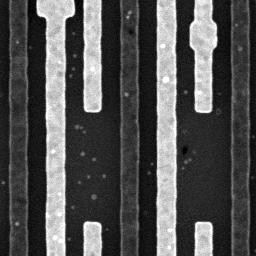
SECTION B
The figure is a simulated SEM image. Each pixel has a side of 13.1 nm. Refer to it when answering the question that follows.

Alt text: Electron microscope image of wiring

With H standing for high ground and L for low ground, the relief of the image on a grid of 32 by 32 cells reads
LHHLLHHHHLLHHLLHHLLLHHLLHHHLLHHL
LHHLLHHHHLLHHLLHHLLLHHLLHHHLLHHL
LHHLLLHHLLLHHLLHHLLLHHLLHHHLLHHL
LHHLLLHHLLLHHLLHHLLLHHLLHHHLLHHL
LHHLLLHHLLLHHLLHHLLLHHLLHHHLLHHL
LHHLLLHHLLLHHLLHHLLLHHLLHHHLLHHL
LHHLLLHHLLLHHLLHHLLLHHLLHHHLLHHL
LHHLLLHHLLLHHLLHHLLLHHLLHHLLLHHL
LHHLLLHHLLLHHLLHHLLLHHLLHHLLLHHL
LHHLLLHHLLLHHLLHHLLLHHLLHHLLLHHL
LHHLLLHHLLLHHLLHHLLLHHLLHHLLLHHL
LHHLLLHHLLLHHLLHHLLLHHLLHHLLLHHL
LHHLLLHHLLLHHLLHHLLLHHLLHHLLLHHL
LHHLLLHHLLLHHLLHHLLLHHLLHHLLLHHL
LHHLLLHHLLLLLLLHHLLLHHLLLLLLLHHL
LHHLLLHHLLLLLLLHHLLLHHLLLLLLLHHL
LHHLLLHHLLLLLLLHHLLLHHLLLLLLLHHL
LHHLLLHHLLLLLLLHHLLLHHLLLLLLLHHL
LHHLLLHHLLLLLLLHHLLLHHLLLLLLLHHL
LHHLLLHHLLLLLLLHHLLLHHLLLLLLLHHL
LHHLLLHHLLLLLLLHHLLLHHLLLLLLLHHL
LHHLLLHHLLLLLLLHHLLLHHLLLLLLLHHL
LHHLLLHHLLLLLLLHHLLLHHLLLLLLLHHL
LHHLLLHHLLLLLLLHHLLLHHLLLLLLLHHL
LHHLLLHHLLLLLLLHHLLLHHLLLLLLLHHL
LHHLLLHHLLLLLLLHHLLLHHLLLLLLLHHL
LHHLLLHHLLLLLLLHHLLLHHLLLLLLLHHL
LHHLLLHHLLLLLLLHHLLLHHLLLLLLLHHL
LHHLLLHHLLLHHLLHHLLLHHLLLHHLLHHL
LHHLLLHHLLLHHLLHHLLLHHLLHHHLLHHL
LHHLLLHHLLLHHLLHHLLLHHLLLHHLLHHL
LHHLLLHHLLLHHLLHHLLLHHLLHHHLLHHL